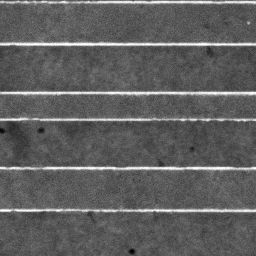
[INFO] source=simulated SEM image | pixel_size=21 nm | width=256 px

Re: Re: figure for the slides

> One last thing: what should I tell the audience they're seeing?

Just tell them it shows lines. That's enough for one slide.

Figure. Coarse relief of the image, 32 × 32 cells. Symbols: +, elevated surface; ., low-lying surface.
++++++++++++++++++++++++++++++++
++++++++++++++++++++++++++++++++
++++++++++++++++++++++++++++++++
++++++++++++++++++++++++++++++++
++++++++++++++++++++++++++++++++
++++++++++++++++++++++++++++++++
................................
................................
................................
................................
................................
................................
++++++++++++++++++++++++++++++++
++++++++++++++++++++++++++++++++
++++++++++++++++++++++++++++++++
................................
................................
................................
................................
................................
................................
++++++++++++++++++++++++++++++++
++++++++++++++++++++++++++++++++
++++++++++++++++++++++++++++++++
++++++++++++++++++++++++++++++++
++++++++++++++++++++++++++++++++
................................
................................
................................
................................
................................
................................